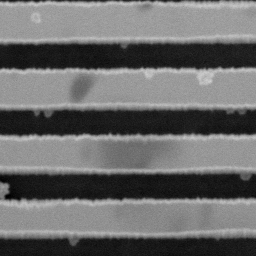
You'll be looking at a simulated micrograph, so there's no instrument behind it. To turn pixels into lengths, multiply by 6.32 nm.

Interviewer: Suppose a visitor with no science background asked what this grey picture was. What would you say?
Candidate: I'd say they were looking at lines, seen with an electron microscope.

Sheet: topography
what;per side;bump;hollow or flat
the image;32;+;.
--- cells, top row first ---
++++++++++++++++++++++++++++++++
++++++++++++++++++++++++++++++++
++++++++++++++++++++++++++++++++
++++++++++++++++++++++++++++++++
++++++++++++++++++++++++++++++++
................................
................................
................................
...............+.++.+......+..++
++++++++++++++++++++++++++++++++
++++++++++++++++++++++++++++++++
++++++++++++++++++++++++++++++++
++++++++++++++++++++++++++++++++
+++++++++++++....+.+++++.+++++++
................................
................................
................................
++++++++++++++++++++++++++++++++
++++++++++++++++++++++++++++++++
++++++++++++++++++++++++++++++++
++++++++++++++++++++++++++++++++
.+.++.++++++++++++++++++++....++
................................
+...............................
+...............................
++++++++++++++++++++++++++++++++
++++++++++++++++++++++++++++++++
++++++++++++++++++++++++++++++++
++++++++++++++++++++++++++++++++
........++.+.++.+++++++.........
................................
................................